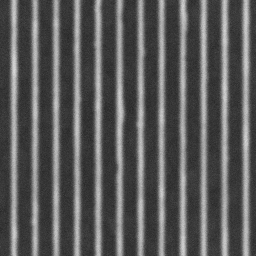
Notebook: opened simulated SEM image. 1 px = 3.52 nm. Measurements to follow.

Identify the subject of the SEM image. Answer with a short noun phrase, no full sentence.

parallel lines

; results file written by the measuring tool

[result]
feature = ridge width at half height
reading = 17.1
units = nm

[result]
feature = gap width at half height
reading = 0.0562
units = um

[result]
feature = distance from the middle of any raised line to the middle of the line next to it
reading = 74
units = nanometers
